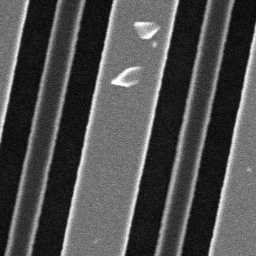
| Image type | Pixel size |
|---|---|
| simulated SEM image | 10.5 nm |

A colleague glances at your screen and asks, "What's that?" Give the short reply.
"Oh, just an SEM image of lines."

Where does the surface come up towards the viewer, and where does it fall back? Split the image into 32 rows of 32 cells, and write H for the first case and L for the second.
HHHHLLLHHHLLLLHHHHHHHHLLLLHHHLLL
HHHLLLLHHHLLLLHHHHHHHHLLLLHHHLLL
HHHLLLLHHHLLLLHHHHHHHHLLLLHHHLLL
HHHLLLLHHHLLLHHHHHHHHHLLLHHHLLLL
HHHLLLHHHHLLLHHHHHHHHLLLLHHHLLLL
HHLLLLHHHLLLLHHHHHHHHLLLLHHHLLLH
HHLLLLHHHLLLLHHHHHHHHLLLLHHHLLLH
HHLLLLHHHLLLLHHHHHHHHLLLHHHHLLLH
HHLLLLHHHLLLHHHHHHHHLLLLHHHLLLLH
HHLLLHHHHLLLHHHHHHHHLLLLHHHLLLLH
HLLLLHHHLLLLHHHHHHHHLLLLHHHLLLHH
HLLLLHHHLLLLHHHHHHHHLLLLHHHLLLHH
HLLLLHHHLLLLHHHHHHHHLLLLHHHLLLHH
HLLLLHHHLLLHHHHHHHHLLLLHHHLLLLHH
HLLLHHHLLLLHHHHHHHHLLLLHHHLLLLHH
LLLLHHHLLLLHHHHHHHHLLLLHHHLLLHHH
LLLLHHHLLLLHHHHHHHHLLLLHHHLLLHHH
LLLLHHHLLLLHHHHHHHHLLLHHHHLLLHHH
LLLHHHHLLLHHHHHHHHLLLLHHHLLLLHHH
LLLHHHHLLLHHHHHHHHLLLLHHHLLLLHHH
LLLHHHLLLLHHHHHHHHLLLLHHHLLLHHHH
LLLHHHLLLLHHHHHHHHLLLLHHHLLLHHHH
LLLHHHLLLLHHHHHHHLLLLLHHLLLLHHHH
LLHHHHLLLHHHHHHHHLLLLHHHLLLLHHHH
LLHHHLLLLHHHHHHHHLLLLHHHLLLLHHHH
LLHHHLLLLHHHHHHHHLLLLHHHLLLHHHHH
LLHHHLLLLHHHHHHHHLLLLHHHLLLHHHHH
LLHHHLLLLHHHHHHHLLLLHHHLLLLHHHHH
LHHHHLLLHHHHHHHHLLLLHHHLLLLHHHHH
LHHHLLLLHHHHHHHHLLLLHHHLLLLHHHHH
LHHHLLLLHHHHHHHHLLLLHHHLLLHHHHHH
LHHHLLLLHHHHHHHHLLLLHHHLLLHHHHHH